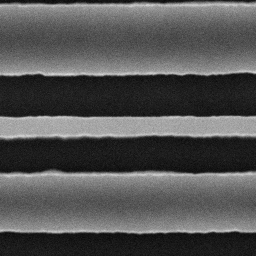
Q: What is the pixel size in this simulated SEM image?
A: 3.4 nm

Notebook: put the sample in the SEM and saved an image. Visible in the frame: lines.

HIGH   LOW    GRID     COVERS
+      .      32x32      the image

........................+++++++.
++++++++++++++++++++++++++++++++
++++++++++++++++++++++++++++++++
++++++++++++++++++++++++++++++++
++++++++++++++++++++++++++++++++
++++++++++++++++++++++++++++++++
++++++++++++++++++++++++++++++++
++++++++++++++++++++++++++++++++
++++++++++++++++++++++++++++++++
................................
................................
................................
................................
................................
................................
++++++++++++++++++++++++++++++++
++++++++++++++++++++++++++++++++
................................
................................
................................
................................
................................
++++++++++++++++++++++++++++++++
++++++++++++++++++++++++++++++++
++++++++++++++++++++++++++++++++
++++++++++++++++++++++++++++++++
++++++++++++++++++++++++++++++++
++++++++++++++++++++++++++++++++
++++++++++++++++++++++++++++++++
................................
................................
................................